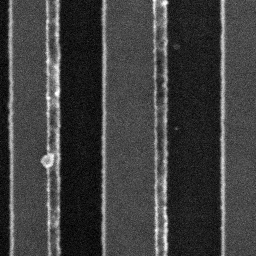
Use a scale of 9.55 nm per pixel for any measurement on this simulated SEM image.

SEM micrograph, lines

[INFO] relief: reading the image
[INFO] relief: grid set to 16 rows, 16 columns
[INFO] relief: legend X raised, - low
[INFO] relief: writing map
-XXX--XXXX----XX
-XXX--XXXX----XX
-XXX--XXXX----XX
-XXX--XXXX----XX
-XXX--XXXX----XX
-XXX--XXXX----XX
-XXX--XXXX----XX
-XXX--XXXX----XX
-XXX--XXXX----XX
-XXX--XXXX----XX
-XXX--XXXX----XX
-XXX--XXXX----XX
-XXX--XXXX----XX
-XXX--XXXX----XX
-XXX--XXXX----XX
-XXX--XXXX----XX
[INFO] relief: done